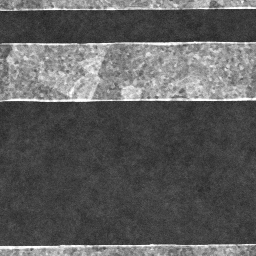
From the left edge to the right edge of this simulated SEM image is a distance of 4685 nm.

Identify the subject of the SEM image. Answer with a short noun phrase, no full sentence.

wiring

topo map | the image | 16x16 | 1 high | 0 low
1111111111111100
0000000000000000
0000000000000000
1111111111111111
1111111111111111
1111111111111111
0000000000000000
0000000000000000
0000000000000000
0000000000000000
0000000000000000
0000000000000000
0000000000000000
0000000000000000
0000000000000000
1111111111111111